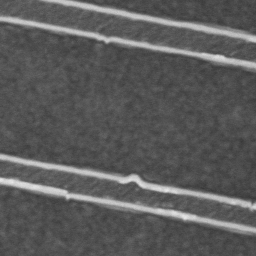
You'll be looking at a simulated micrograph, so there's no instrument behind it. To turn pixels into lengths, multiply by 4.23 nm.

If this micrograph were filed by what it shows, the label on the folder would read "one or a few lines or trenches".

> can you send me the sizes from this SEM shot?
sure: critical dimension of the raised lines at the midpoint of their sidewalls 114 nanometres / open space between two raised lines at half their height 0.57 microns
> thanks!